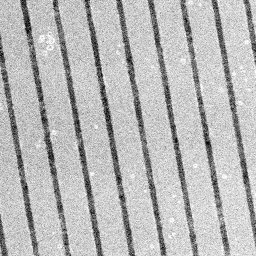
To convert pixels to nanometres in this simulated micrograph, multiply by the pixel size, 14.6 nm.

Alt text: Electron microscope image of parallel lines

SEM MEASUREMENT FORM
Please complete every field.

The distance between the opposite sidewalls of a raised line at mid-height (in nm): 93.6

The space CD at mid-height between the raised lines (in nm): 362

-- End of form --